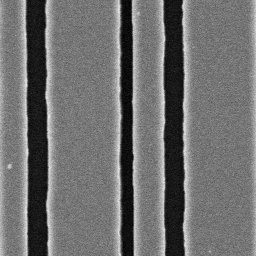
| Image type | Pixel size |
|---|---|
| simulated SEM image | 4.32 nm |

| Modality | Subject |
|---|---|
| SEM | lines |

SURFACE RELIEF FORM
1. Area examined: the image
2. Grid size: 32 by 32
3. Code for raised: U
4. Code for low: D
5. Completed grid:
UUUDDDUUUUUUUUUDDUUUDDDUUUUUUUUU
UUUDDDUUUUUUUUUDDUUUDDDUUUUUUUUU
UUUDDDUUUUUUUUUDDUUUDDDUUUUUUUUU
UUUDDDUUUUUUUUUDDUUUDDDUUUUUUUUU
UUUDDDUUUUUUUUUDDUUUUDDUUUUUUUUU
UUUDDDUUUUUUUUUDDUUUUDDUUUUUUUUU
UUUDDDUUUUUUUUUDDUUUDDDUUUUUUUUU
UUUDDDUUUUUUUUUDDUUUDDDUUUUUUUUU
UUUDDDUUUUUUUUUDDUUUDDDUUUUUUUUU
UUUDDDUUUUUUUUUDDUUUDDDUUUUUUUUU
UUUDDDUUUUUUUUUDDUUUDDDUUUUUUUUU
UUUDDDUUUUUUUUUDDUUUDDDUUUUUUUUU
UUUDDDUUUUUUUUUDDUUUUDDUUUUUUUUU
UUUDDDUUUUUUUUUDDUUUUDDUUUUUUUUU
UUUDDDUUUUUUUUUDDUUUUDDUUUUUUUUU
UUUDDDUUUUUUUUUDDUUUUDDUUUUUUUUU
UUUDDDUUUUUUUUUDDUUUDDDUUUUUUUUU
UUUDDDUUUUUUUUUDDUUUDDDUUUUUUUUU
UUUDDDUUUUUUUUUDDUUUDDDUUUUUUUUU
UUUDDDUUUUUUUUUDDUUUDDDUUUUUUUUU
UUUDDDUUUUUUUUUDDUUUDDDUUUUUUUUU
UUUDDDUUUUUUUUUDDUUUDDDUUUUUUUUU
UUUDDDUUUUUUUUUDDUUUUDDUUUUUUUUU
UUUDDDUUUUUUUUUDDUUUUDDUUUUUUUUU
UUUDDDUUUUUUUUUDDUUUDDDUUUUUUUUU
UUUDDDUUUUUUUUUDDUUUDDDUUUUUUUUU
UUUDDDUUUUUUUUUDDUUUDDDUUUUUUUUU
UUUDDDUUUUUUUUUDDUUUDDDUUUUUUUUU
UUUDDDUUUUUUUUUDDUUUUDDUUUUUUUUU
UUUDDDUUUUUUUUUDDUUUUDDUUUUUUUUU
UUUDDDUUUUUUUUUDDUUUUDDUUUUUUUUU
UUUDDDUUUUUUUUUDDUUUUDDUUUUUUUUU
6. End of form